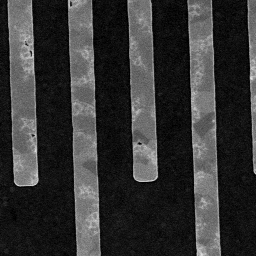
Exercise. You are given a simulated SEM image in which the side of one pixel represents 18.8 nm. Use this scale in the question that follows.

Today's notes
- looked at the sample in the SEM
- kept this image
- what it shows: parallel lines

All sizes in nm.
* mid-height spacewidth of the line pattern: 680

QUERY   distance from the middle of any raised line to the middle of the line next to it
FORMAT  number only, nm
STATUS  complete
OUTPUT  1130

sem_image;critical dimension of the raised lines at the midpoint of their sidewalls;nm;442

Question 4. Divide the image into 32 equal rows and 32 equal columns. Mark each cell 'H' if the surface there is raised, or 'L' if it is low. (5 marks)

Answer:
LHHHLLLLLHHLLLLLHHHLLLLHHHLLLLLH
LHHHLLLLLHHLLLLLHHHLLLLLHHLLLLLH
LHHHLLLLLHHLLLLLHHHLLLLLHHLLLLLH
LHHHLLLLLHHHLLLLHHHLLLLLHHHLLLLH
LHHHLLLLLHHHLLLLHHHLLLLLHHHLLLLH
LHHHLLLLLHHHLLLLHHHLLLLLHHHLLLLH
LHHHLLLLLHHHLLLLHHHLLLLLHHHLLLLH
LHHHLLLLLHHHLLLLHHHLLLLLHHHLLLLH
LHHHLLLLLHHHLLLLHHHLLLLLHHHLLLLH
LHHHLLLLLHHHLLLLHHHLLLLLHHHLLLLH
LHHHLLLLLHHHLLLLHHHLLLLLHHHLLLLH
LHHHLLLLLHHHLLLLHHHLLLLLHHHLLLLH
LHHHLLLLLHHHLLLLHHHLLLLLHHHLLLLH
LHHHLLLLLHHHLLLLHHHLLLLLHHHLLLLH
LLHHLLLLLHHHLLLLLHHLLLLLHHHLLLLH
LLHHLLLLLHHHLLLLLHHLLLLLHHHLLLLL
LLHHLLLLLHHHLLLLLHHLLLLLHHHLLLLL
LLHHHLLLLHHHLLLLLHHHLLLLHHHLLLLL
LLHHHLLLLHHHLLLLLHHHLLLLHHHLLLLL
LLHHHLLLLHHHLLLLLHHHLLLLHHHLLLLL
LLHHHLLLLHHHLLLLLHHHLLLLHHHLLLLL
LLHHHLLLLHHHLLLLLHHHLLLLHHHLLLLL
LLHHHLLLLHHHLLLLLHHLLLLLHHHLLLLL
LLLLLLLLLHHHLLLLLLLLLLLLHHHLLLLL
LLLLLLLLLHHHLLLLLLLLLLLLHHHLLLLL
LLLLLLLLLHHHLLLLLLLLLLLLHHHLLLLL
LLLLLLLLLHHHLLLLLLLLLLLLHHHLLLLL
LLLLLLLLLLHHLLLLLLLLLLLLHHHLLLLL
LLLLLLLLLLHHLLLLLLLLLLLLLHHLLLLL
LLLLLLLLLLHHLLLLLLLLLLLLLHHLLLLL
LLLLLLLLLLHHLLLLLLLLLLLLLHHHLLLL
LLLLLLLLLLHHLLLLLLLLLLLLLHHHLLLL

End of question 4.